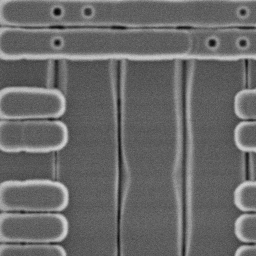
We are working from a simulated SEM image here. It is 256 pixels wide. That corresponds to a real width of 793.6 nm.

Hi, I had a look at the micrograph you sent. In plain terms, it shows wiring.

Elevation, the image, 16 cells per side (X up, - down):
XXXXXXXXXXXXXXXX
XXXXXXXXXXXXXXXX
XXXXXXXXXXXXXXXX
XXXXXXXXXXXXXXXX
----------------
----------------
XXXX-----------X
XXXX-----------X
XXXX-----------X
----------------
----------------
XXXX-----------X
XXXX-----------X
XXXX-----------X
XXXX-----------X
XXXX-----------X